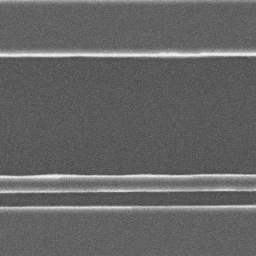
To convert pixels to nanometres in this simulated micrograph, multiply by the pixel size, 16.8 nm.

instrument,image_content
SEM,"lines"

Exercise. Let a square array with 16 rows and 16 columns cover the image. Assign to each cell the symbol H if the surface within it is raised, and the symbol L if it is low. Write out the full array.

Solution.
HHHHHHHHHHHHHHHH
HHHHHHHHHHHHHHHH
HHHHHHHHHHHHHHHH
LLLLLLLLLLLLLLLL
LLLLLLLLLLLLLLLL
LLLLLLLLLLLLLLLL
LLLLLLLLLLLLLLLL
LLLLLLLLLLLLLLLL
LLLLLLLLLLLLLLLL
LLLLLLLLLLLLLLLL
LLLLLLLLLLLLLLLL
HHHHHHHHHHHHHHHH
HHHHHHHHHHHHHHHH
HHHHHHHHHHHHHHHH
HHHHHHHHHHHHHHHH
HHHHHHHHHHHHHHHH